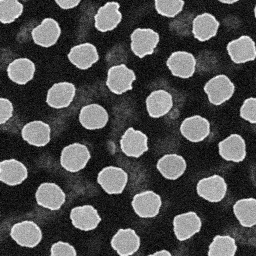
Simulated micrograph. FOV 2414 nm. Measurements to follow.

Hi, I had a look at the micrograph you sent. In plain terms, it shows a regular array of raised bodies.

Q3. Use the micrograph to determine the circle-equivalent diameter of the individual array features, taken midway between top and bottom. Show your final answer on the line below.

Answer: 250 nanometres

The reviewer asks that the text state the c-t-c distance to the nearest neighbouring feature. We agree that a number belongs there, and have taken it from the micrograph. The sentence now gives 0.411 um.